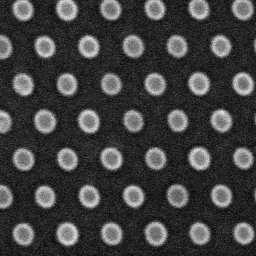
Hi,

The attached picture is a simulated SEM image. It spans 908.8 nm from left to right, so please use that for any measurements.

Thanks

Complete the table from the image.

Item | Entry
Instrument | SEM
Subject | a regular array of raised bodies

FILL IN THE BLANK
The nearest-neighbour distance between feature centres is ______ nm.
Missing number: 153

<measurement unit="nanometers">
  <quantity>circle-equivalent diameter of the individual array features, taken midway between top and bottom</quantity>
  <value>67.2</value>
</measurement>